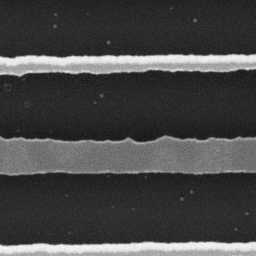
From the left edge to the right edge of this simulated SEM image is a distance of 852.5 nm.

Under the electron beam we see lines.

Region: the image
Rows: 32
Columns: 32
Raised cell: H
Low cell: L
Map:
LLLLLLLLLLLLLLLLLLLLLLLLLLLLLLLL
LLLLLLLLLLLLLLLLLLLLLLLLLLLLLLLL
LLLLLLLLLLLLLLLLLLLLLLLLLLLLLLLL
LLLLLLLLLLLLLLLLLLLLLLLLLLLLLLLL
LLLLLLLLLLLLLLLLLLLLLLLLLLLLLLLL
LLLLLLLLLLLLLLLLLLLLLLLLLLLLLLLL
LLLLLLLLLLLLLLLLLLLLLLLLLLLLLLLL
HLHHHHHHHHHHHHHHHHHHHHHHHHHHHHHH
HHHHHHHHHHHHHHHHHHHHHHHHHHHHHHHH
LLLLLLLLLLLLLLLLLLLLLLLLLLLLLLLL
LLLLLLLLLLLLLLLLLLLLLLLLLLLLLLLL
LLLLLLLLLLLLLLLLLLLLLLLLLLLLLLLL
LLLLLLLLLLLLLLLLLLLLLLLLLLLLLLLL
LLLLLLLLLLLLLLLLLLLLLLLLLLLLLLLL
LLLLLLLLLLLLLLLLLLLLLLLLLLLLLLLL
LLLLLLLLLLLLLLLLLLLLLLLLLLLLLLLL
LLLLLLLLLLLLLLLLLLLLLLLLLLLLLLLL
HHHHHHHLLLLLLLLHHLLHHHHHHLHHHHHH
HHHHHHHHHHHHHHHHHHHHHHHHHHHHHHHH
HHHHHHHHHHHHHHHHHHHHHHHHHHHHHHHH
HHHHHHHHHHHHHHHHHHHHHHHHHHHHHHHH
HHHHHHLLHHHHHLHHHHLLLHHHHHHHLLLL
LLLLLLLLLLLLLLLLLLLLLLLLLLLLLLLL
LLLLLLLLLLLLLLLLLLLLLLLLLLLLLLLL
LLLLLLLLLLLLLLLLLLLLLLLLLLLLLLLL
LLLLLLLLLLLLLLLLLLLLLLLLLLLLLLLL
LLLLLLLLLLLLLLLLLLLLLLLLLLLLLLLL
LLLLLLLLLLLLLLLLLLLLLLLLLLLLLLLL
LLLLLLLLLLLLLLLLLLLLLLLLLLLLLLLL
LLLLLLLLLLLLLLLLLLLLLLLLLLLLLLLL
LLLLLLLLLLLLLLLLLLLLLLLLLLLLLLLL
HHHHHHHHHHHHHHHHHHHHHHHHHHHHHHHH